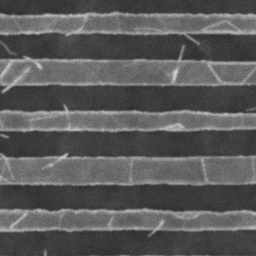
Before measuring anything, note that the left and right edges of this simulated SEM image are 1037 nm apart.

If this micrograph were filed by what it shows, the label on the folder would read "lines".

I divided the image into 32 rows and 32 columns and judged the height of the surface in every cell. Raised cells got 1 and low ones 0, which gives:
00000000000000000000000000000000
00000000000000000000000000000000
11111111111111111111111111111111
11111111111111111111111111111111
00000000000000000000000000000000
00000000000000000000000000000000
00000000000000000000000000000000
11111111111000001110001000000000
11111111111111111111111111111111
11111111111111111111111111111111
11111101111101111111111111111111
00000000000000000000000000000000
00000000000000000000000000000000
00000000000000000000000000000000
11111111111111111111111111111111
11111111111111111111111111111111
00000000000000000000000000000000
00000000000000000000000000000000
00000000000000000000000000000000
00000000000000000000000000000000
11111111111111111111111111111111
11111111111111111111111111111111
11111111111111111111111111111111
00000000000000000000000000000000
00000000000000000000000000000000
00000000000000000000000000000000
11111111111111111111100111000111
11111111111111111111111111111111
11111111111111111111111111111111
00000000000000000000000000000000
00000000000000000000000000000000
00000000000000000000000000000000